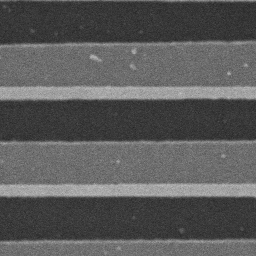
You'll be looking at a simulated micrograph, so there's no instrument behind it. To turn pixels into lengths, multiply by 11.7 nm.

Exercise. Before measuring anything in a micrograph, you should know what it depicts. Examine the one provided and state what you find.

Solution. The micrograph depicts lines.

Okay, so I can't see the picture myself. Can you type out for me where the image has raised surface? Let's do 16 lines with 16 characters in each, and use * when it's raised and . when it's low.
................
................
................
****************
****************
****************
................
................
................
****************
****************
****************
................
................
................
****************